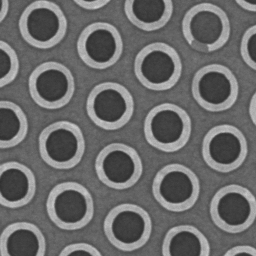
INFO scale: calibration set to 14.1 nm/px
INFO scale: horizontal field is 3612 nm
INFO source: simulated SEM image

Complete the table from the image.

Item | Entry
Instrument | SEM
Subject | a regular array of ring-shaped raised bodies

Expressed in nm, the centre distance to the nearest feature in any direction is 866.